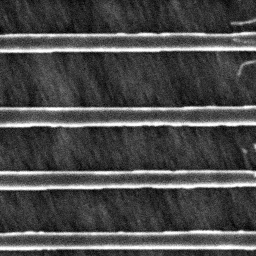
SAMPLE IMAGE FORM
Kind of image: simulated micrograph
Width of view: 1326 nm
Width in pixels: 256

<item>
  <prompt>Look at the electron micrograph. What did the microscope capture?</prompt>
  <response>lines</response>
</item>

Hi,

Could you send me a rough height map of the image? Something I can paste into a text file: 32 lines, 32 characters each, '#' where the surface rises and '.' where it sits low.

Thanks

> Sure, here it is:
................................
................................
................................
................................
################################
################################
................................
................................
................................
................................
................................
................................
................................
.......................#########
################################
################################
................................
................................
................................
................................
................................
................################
################################
#############...................
................................
................................
................................
................................
................................
################################
################################
................................